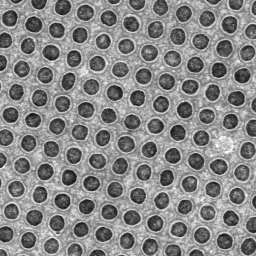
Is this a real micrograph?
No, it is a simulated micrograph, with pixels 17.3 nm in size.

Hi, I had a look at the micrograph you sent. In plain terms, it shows a regular array of holes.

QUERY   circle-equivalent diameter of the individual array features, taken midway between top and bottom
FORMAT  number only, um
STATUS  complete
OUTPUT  0.283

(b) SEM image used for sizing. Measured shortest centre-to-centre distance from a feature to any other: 399 nanometres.